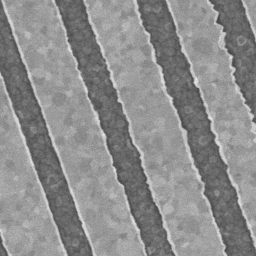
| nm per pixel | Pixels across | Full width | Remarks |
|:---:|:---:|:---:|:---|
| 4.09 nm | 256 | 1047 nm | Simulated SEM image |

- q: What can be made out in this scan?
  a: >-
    one or a few lines or trenches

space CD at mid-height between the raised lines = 113 nm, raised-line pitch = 0.309 um